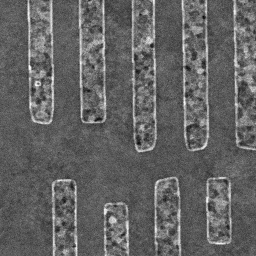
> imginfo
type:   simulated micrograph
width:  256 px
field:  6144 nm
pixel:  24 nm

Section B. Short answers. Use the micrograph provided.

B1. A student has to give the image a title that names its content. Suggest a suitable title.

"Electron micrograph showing wiring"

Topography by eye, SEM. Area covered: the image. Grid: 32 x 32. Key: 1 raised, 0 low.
00001100001110000110000111000111
00001100001110000110000111000111
00001100001110000110000111000111
00001100001110000110000111000111
00001100001110000110000111000111
00001100001110000110000111000111
00001100001110000110000111000111
00001100001110000110000111000111
00001100001110000110000111000111
00001100001110000110000111000111
00001100001110000110000111000011
00001100001110000110000111000011
00001110001110000110000111000011
00001110001110000110000111000011
00001100001110000110000111000011
00000000000000000110000111000011
00000000000000000110000111000011
00000000000000000110000111000011
00000000000000000110000010000001
00000000000000000000000000000000
00000000000000000000000000000000
00000000000000000000000000000000
00000000000000000000110000110000
00000001100000000001110000111000
00000001100000000001110000111000
00000001100000000001110000111000
00000001100001110001110000111000
00000001100001110001110000111000
00000001100001110000110000111000
00000001100001110001110000111000
00000001100001110000110000000000
00000001100001110000110000000000